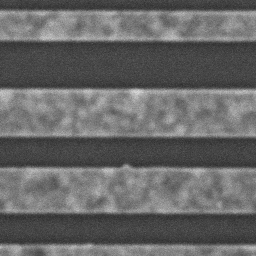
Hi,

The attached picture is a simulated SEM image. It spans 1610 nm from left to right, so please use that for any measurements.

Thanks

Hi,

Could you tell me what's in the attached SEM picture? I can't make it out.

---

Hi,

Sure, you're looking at one or a few lines or trenches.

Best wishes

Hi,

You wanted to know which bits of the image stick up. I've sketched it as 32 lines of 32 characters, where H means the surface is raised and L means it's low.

LLLLLLLLLLLLLLLLLLLLLLLLLLLLLLLL
HHHLLLLLLLLLLLLLLLLLLLLLLLLLLLLL
HHHHHHHHHHHHHHHHHHHHHHHHHHHHHHHH
HHHHHHHHHHHHHHHHHHHHHHHHHHHHHHHH
HHHHHHHHHHHHHHHHHHHHHHHHHHHHHHHH
LLLLLLLLLLLLLLLLLLLLLLLLLLLLLLLL
LLLLLLLLLLLLLLLLLLLLLLLLLLLLLLLL
LLLLLLLLLLLLLLLLLLLLLLLLLLLLLLLL
LLLLLLLLLLLLLLLLLLLLLLLLLLLLLLLL
LLLLLLLLLLLLLLLLLLLLLLLLLLLLLLLL
LLLLLLLLLLLLLLLLLLLLLLLLLLLLLLLL
HHHHHHHHHHHHHHHHHHHHHHHHHHHHHHHH
HHHHHHHHHHHHHHHHHHHHHHHHHHHHHHHH
HHHHHHHHHHHHHHHHHHHHHHHHHHHHHHHH
HHHHHHHHHHHHHHHHHHHHHHHHHHHHHHHH
HHHHHHHHHHHHHHHHHHHHHHHHHHHHHHHH
HHHHHHHHHHHHHHHHHHHHHHHHHHHHHHHH
LLLLLLLLLLLLLLLLLLLLLLLLLLLLLLLL
LLLLLLLLLLLLLLLLLLLLLLLLLLLLLLLL
LLLLLLLLLLLLLLLLLLLLLLLLLLLLLLLL
LLLLLLLLLLLLLLLLLLLLLLLLLLLLLLLL
HHHHHHHHHHHHHHHHHHHHHHHHHHHHHHHH
HHHHHHHHHHHHHHHHHHHHHHHHHHHHHHHH
HHHHHHHHHHHHHHHHHHHHHHHHHHHHHHHH
HHHHHHHHHHHHHHHHHHHHHHHHHHHHHHHH
HHHHHHHHHHHHHHHHHHHHHHHHHHHHHHHH
LLLLLLLLLLLLLLLLLLLLHLLLLHHHHHHH
LLLLLLLLLLLLLLLLLLLLLLLLLLLLLLLL
LLLLLLLLLLLLLLLLLLLLLLLLLLLLLLLL
LLLLLLLLLLLLLLLLLLLLLLLLLLLLLLLL
LLLLLLLLLLLLLLLLLLLLLLLLLLLLLLLL
HHHHHHHHHHHHHHHHHHHHHHHHHHHHHHHH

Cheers